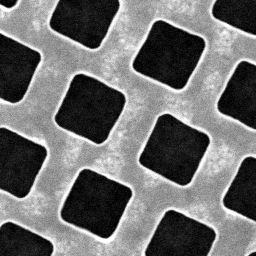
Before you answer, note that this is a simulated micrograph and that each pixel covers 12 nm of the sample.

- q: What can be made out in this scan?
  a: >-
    holes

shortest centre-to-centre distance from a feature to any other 1140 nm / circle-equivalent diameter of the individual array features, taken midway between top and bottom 777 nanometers